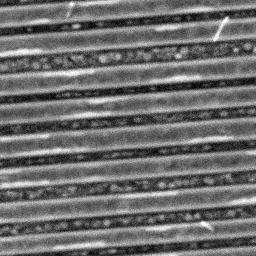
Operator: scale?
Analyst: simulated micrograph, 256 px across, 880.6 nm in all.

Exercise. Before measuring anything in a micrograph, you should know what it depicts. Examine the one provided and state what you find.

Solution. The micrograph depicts parallel lines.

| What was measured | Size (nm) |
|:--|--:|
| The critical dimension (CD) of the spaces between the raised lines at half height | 45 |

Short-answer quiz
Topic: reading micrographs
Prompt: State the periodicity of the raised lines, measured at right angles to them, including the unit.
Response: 113 nanometers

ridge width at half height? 63.5 nm